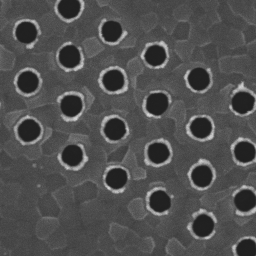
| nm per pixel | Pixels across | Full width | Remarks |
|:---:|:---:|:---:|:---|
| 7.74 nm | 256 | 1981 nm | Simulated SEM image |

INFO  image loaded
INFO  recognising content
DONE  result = a regular array of holes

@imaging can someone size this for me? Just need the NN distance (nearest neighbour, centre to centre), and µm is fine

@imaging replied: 0.377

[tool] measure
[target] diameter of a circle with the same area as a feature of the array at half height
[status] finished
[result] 166 nm